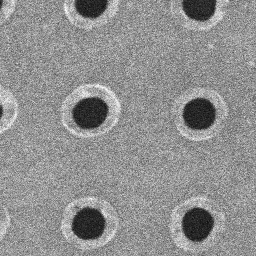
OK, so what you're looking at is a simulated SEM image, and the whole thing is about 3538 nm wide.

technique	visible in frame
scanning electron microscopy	ring-shaped raised bodies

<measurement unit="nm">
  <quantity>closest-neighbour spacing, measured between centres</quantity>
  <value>1480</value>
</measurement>